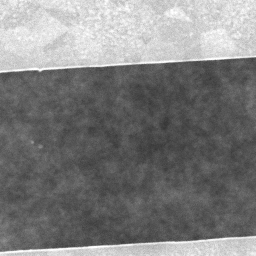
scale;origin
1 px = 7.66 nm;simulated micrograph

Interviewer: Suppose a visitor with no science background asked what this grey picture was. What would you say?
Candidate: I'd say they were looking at one or a few lines or trenches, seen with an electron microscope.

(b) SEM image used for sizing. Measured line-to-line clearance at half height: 1380 nm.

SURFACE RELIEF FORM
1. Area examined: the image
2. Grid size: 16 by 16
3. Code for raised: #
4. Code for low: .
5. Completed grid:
################
################
################
################
................
................
................
................
................
................
................
................
................
................
................
.....###########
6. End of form